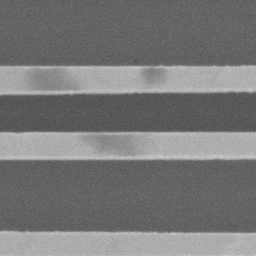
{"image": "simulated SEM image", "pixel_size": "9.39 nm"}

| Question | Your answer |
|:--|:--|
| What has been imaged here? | lines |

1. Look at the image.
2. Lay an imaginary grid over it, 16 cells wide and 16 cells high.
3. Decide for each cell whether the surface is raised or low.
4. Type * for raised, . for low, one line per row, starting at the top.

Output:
................
................
................
................
****************
****************
................
................
****************
****************
................
................
................
................
**..............
****************